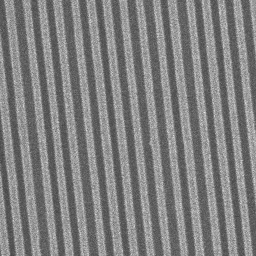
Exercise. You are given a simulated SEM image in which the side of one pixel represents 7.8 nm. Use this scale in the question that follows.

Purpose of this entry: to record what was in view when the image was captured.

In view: parallel lines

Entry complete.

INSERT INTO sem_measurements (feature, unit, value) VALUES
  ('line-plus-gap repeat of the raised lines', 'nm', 126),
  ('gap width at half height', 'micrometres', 0.0591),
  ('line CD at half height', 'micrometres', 0.0658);